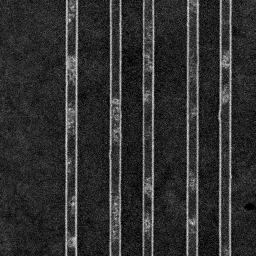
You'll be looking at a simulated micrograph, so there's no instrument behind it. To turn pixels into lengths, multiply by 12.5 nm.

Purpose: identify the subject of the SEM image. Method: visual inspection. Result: parallel lines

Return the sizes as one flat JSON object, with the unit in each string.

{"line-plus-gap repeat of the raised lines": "0.48 microns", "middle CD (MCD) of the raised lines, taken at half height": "126 nm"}